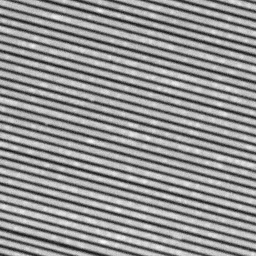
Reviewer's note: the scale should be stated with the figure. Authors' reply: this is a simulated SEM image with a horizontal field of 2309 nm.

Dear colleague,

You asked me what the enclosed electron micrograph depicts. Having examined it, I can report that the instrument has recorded parallel lines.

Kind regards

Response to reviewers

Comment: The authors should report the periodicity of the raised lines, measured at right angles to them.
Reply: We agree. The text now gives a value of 77.3 nanometers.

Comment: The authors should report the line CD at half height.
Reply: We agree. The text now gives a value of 0.0501 micrometres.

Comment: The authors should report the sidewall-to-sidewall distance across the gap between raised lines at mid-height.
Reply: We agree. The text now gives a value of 32.7 nm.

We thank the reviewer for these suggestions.